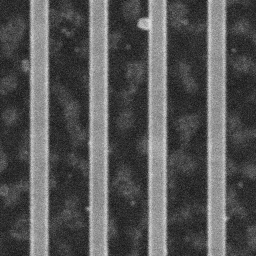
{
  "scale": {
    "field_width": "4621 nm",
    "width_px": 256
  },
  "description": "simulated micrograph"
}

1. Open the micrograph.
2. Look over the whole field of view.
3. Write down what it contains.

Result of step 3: parallel lines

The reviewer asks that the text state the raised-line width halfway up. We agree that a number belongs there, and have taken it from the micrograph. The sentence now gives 0.289 micrometres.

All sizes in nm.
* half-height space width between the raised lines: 783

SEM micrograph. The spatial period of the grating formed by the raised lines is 1070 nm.